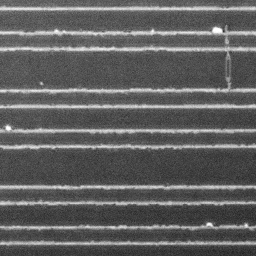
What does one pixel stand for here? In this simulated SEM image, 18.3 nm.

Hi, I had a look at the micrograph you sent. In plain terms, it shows lines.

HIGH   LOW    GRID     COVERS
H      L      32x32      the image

HHHHHHHHHHHHHHHHHHHHHHHHHHHHHHHH
LLLLLLLLLLLLLLLLLLLLLLLLLLLLLLLL
LLLLLLLLLLLLLLLLLLLLLLLLLLLLLLLL
LLLLLLLLLLLLLLLLLLLLLLLLLLLLLLLL
HHHHHHHHHHHHHHHHHHHHHHHHHHHHHHHH
HHHHHHHHHHHHHHHHHHHHHHHHHHHHHHHH
LLLLLLLLLLLLLLLLLLLLLLLLLLLLLLLL
LLLLLLLLLLLLLLLLLLLLLLLLLLLLLLLL
LLLLLLLLLLLLLLLLLLLLLLLLLLLLLLLL
LLLLLLLLLLLLLLLLLLLLLLLLLLLLLLLL
LLLLLLLLLLLLLLLLLLLLLLLLLLLLLLLL
HHHHHHHHHHHHHHHHHHHHHHHHHHHHHHHH
HHHHHHHHHHHHHHHHHHHHHHHHHHHHHHHH
LLLLLLLLLLLLLLLLLLLLLLLLLLLLLLLL
LLLLLLLLLLLLLLLLLLLLLLLLLLLLLLLL
LLLLLLLLLLLLLLLLLLLLLLLLLLLLLLLL
HHHHHHHHHHHHHHHHHHHHHHHHHHHHHHHH
HHHHHHHHHHHHHHHHHHHHHHHHHHHHHHHH
LLLLLLLLLLLLLLLLLLLLLLLLLLLLLLLL
LLLLLLLLLLLLLLLLLLLLLLLLLLLLLLLL
LLLLLLLLLLLLLLLLLLLLLLLLLLLLLLLL
LLLLLLLLLLLLLLLLLLLLLLLLLLLLLLLL
LLLLLLLLLLLLLLLLLLLLLLLLLLLLLLLL
HHHHHHHHHHHHHHHHHHHHHHHHHHHHHHHH
HHHHHHHHHHHHHHHHHHHHHHHHHHHHHHHH
LLLLLLLLLLLLLLLLLLLLLLLLLLLLLLLL
LLLLLLLLLLLLLLLLLLLLLLLLLLLLLLLL
LLLLLLLLLLLLLLLLLLLLLLLLLLLLLLLL
HHHHHHHHHHHHHHHHHHHHHHHHHHHHHHHH
HHHHHHHHHHHHHHHHHHHHHHHHHHHHHHHH
LLLLLLLLLLLLLLLLLLLLLLLLLLLLLLLL
LLLLLLLLLLLLLLLLLLLLLLLLLLLLLLLL